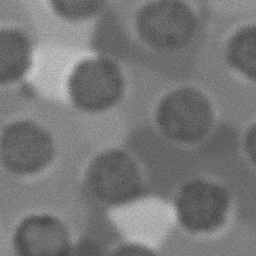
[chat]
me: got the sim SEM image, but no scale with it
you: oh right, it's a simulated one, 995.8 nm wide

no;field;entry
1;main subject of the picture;holes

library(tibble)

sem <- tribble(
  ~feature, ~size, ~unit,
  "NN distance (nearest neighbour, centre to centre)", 0.36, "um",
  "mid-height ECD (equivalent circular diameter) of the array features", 222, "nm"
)